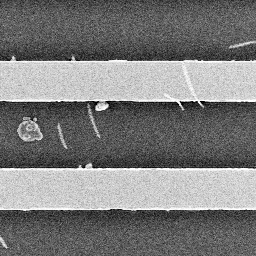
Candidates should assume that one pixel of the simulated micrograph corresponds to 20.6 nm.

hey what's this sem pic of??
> lines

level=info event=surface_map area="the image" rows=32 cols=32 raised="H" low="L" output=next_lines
LLLLLLLLLLLLLLLLLLLLLLLLLLLLLLLL
LLLLLLLLLLLLLLLLLLLLLLLLLLLLLLLL
LLLLLLLLLLLLLLLLLLLLLLLLLLLLLLLL
LLLLLLLLLLLLLLLLLLLLLLLLLLLLLLLL
LLLLLLLLLLLLLLLLLLLLLLLLLLLLLLLL
LLLLLLLLLLLLLLLLLLLLLLLLLLLLLLLL
LLLLLLLLLLLLLLLLLLLLLLLLLLLLLLLL
LLLLLLLLLLLLLLLLLLLLLLLLLLLLLLLL
HHHHHHHHHHHHHHHHHHHHHHHHHHHHHHHH
HHHHHHHHHHHHHHHHHHHHHHHHHHHHHHHH
HHHHHHHHHHHHHHHHHHHHHHHHHHHHHHHH
HHHHHHHHHHHHHHHHHHHHHHHHHHHHHHHH
HHHHHHHHHHHHHHLLHHHHHHHHHHHHHHHH
LLLLLLLLLLLLLLLLLLLLLLLLLLLLLLLL
LLLLLLLLLLLLLLLLLLLLLLLLLLLLLLLL
LLLLLLLLLLLLLLLLLLLLLLLLLLLLLLLL
LLLLLLLLLLLLLLLLLLLLLLLLLLLLLLLL
LLLLLLLLLLLLLLLLLLLLLLLLLLLLLLLL
LLLLLLLLLLLLLLLLLLLLLLLLLLLLLLLL
LLLLLLLLLLLLLLLLLLLLLLLLLLLLLLLL
LLLLLLLLLLLLLLLLLLLLLLLLLLLLLLLL
HHHHHHHHHHHHHHHHHHHHHHHHHHHHHHHH
HHHHHHHHHHHHHHHHHHHHHHHHHHHHHHHH
HHHHHHHHHHHHHHHHHHHHHHHHHHHHHHHH
HHHHHHHHHHHHHHHHHHHHHHHHHHHHHHHH
HHHHHHHHHHHHHHHHHHHHHHHHHHHHHHHH
LLLLLLLLLLLLLLLLLLLLLLLLLLLLLLLL
LLLLLLLLLLLLLLLLLLLLLLLLLLLLLLLL
LLLLLLLLLLLLLLLLLLLLLLLLLLLLLLLL
LLLLLLLLLLLLLLLLLLLLLLLLLLLLLLLL
LLLLLLLLLLLLLLLLLLLLLLLLLLLLLLLL
LLLLLLLLLLLLLLLLLLLLLLLLLLLLLLLL